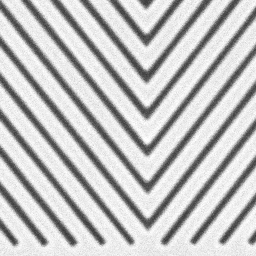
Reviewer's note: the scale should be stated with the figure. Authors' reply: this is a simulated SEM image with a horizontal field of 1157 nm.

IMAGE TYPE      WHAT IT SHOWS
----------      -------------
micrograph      groups of lines, slits or small figures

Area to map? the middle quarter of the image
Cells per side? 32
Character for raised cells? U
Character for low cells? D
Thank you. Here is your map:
UUDDDUUUUUDDUUUUUDDDUUDDUUUUUDDD
UUUDDDUUUUDDDUUUUDDDDDDDUUUUDDDU
UUUUDDUUUUUDDDUUUUDDDDDUUUUDDDUU
UUUUUDDUUUUUDDDUUUUDDDUUUUUDDUUU
DUUUUDDDUUUUUDDUUUUUDUUUUUDDDUUU
DDUUUUDDDUUUUDDDUUUUUUUUUDDDUUUU
DDUUUUUDDDUUUUDDDUUUUUUUDDDUUUUU
UDDUUUUUDDDUUUUDDDUUUUUUDDUUUUUD
UDDDUUUUDDDUUUUUDDDUUUUDDDUUUUDD
UUDDDUUUUDDDUUUUUDDDUUDDDUUUUDDD
UUUDDDUUUUDDDUUUUDDDUDDDUUUUUDDU
UUUUDDUUUUUDDDUUUUDDDDDUUUUUDDUU
UUUUDDDUUUUUDDDUUUUDDDUUUUUDDDUU
DUUUUDDDUUUUUDDUUUUUDDUUUUDDDUUU
DUUUUUDDDUUUUDDDUUUUUUUUUDDDUUUU
DDUUUUUDDDUUUUDDDUUUUUUUUDDUUUUU
DDDUUUUUDDUUUUUDDDUUUUUUDDUUUUUD
UDDDUUUUDDDUUUUUDDDUUUUDDDUUUUDD
UUDDDUUUUDDDUUUUUDDUUUDDDUUUUDDD
UUUDDDUUUUDDDUUUUDDDUDDDUUUUUDDU
UUUDDDUUUUUDDDUUUUDDDDDUUUUUDDDU
UUUUDDDUUUUUDDUUUUUDDDDUUUUDDDUU
DUUUUDDDUUUUDDDUUUUUDDUUUUDDDUUU
DUUUUUDDDUUUUDDDUUUUUUUUUUDDUUUU
DDUUUUUDDDUUUUDDDUUUUUUUUDDDUUUU
DDDUUUUUDDUUUUUDDDUUUUUUDDDUUUUD
UDDDUUUUDDDUUUUUDDUUUUUDDDUUUUDD
UUDDDUUUUDDDUUUUUDDUUUDDDUUUUUDD
UUUDDUUUUUDDDUUUUDDDUUDDUUUUUDDD
UUUDDDUUUUUDDDUUUUDDDDDDUUUUDDDU
UUUUDDDUUUUUDDUUUUUDDDDUUUUDDDUU
UUUUUDDDUUUUDDDUUUUUDDUUUUUDDUUU